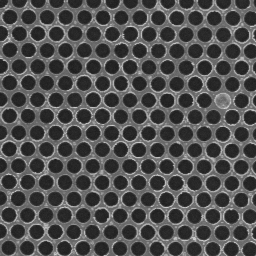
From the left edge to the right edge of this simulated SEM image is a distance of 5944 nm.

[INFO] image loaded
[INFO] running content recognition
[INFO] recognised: a regular array of holes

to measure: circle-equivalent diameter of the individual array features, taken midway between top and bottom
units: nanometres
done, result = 352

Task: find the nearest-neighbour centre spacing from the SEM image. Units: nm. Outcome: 428